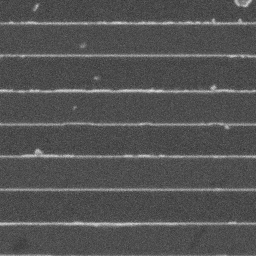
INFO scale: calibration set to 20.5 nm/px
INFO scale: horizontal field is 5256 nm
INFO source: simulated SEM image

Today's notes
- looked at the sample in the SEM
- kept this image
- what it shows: lines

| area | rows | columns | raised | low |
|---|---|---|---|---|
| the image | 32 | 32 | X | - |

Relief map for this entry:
------------------------------X-
--------------------------------
--------------------------------
XXXXXXXXXXXXXXXXXXXXXXXXXXXXXXXX
XXXXXXXXXXXXXXXXXXXXXXXXXXXXXXXX
XXXXXXXXXXXXXXXXXXXXXXXXXXXXXXXX
XXXXXXXXXXXXXXXXXXXXXXXXXXXXXXXX
--------------------------------
--------------------------------
--------------------------------
--------------------------------
XXXXXXXXXXXXXXXXXXXXXXXXXXXXXXXX
XXXXXXXXXXXXXXXXXXXXXXXXXXXXXXXX
XXXXXXXXXXXXXXXXXXXXXXXXXXXXXXXX
XXXXXXXXXXXXXXXXXXXXXXXXXXXXXXXX
XXXXXXXXX--XXXXXXXXXXXXXXXXXXXXX
--------------------------------
--------------------------------
--------------------------------
---XXXXXX--------XX-------------
XXXXXXXXXXXXXXXXXXXXXXXXXXXXXXXX
XXXXXXXXXXXXXXXXXXXXXXXXXXXXXXXX
XXXXXXXXXXXXXXXXXXXXXXXXXXXXXXXX
XXXXXXXXXXXXXXXXXXXXXXXXXXXXXXXX
--------------------------------
--------------------------------
--------------------------------
--------------------------------
XXXXXXXXXXXXXXXXXXXXXXXXXXXXXXXX
XXXXXXXXXXXXXXXXXXXXXXXXXXXXXXXX
XXXXXXXXXXXXXXXXXXXXXXXXXXXXXXXX
XXXXXXXXXXXXXXXXXXXXXXXXXXXXXXXX